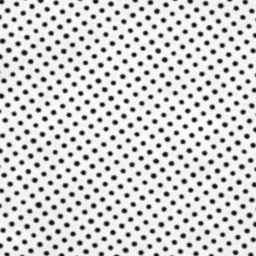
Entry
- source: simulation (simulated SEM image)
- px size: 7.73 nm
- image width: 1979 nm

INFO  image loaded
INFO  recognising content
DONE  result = a regular array of holes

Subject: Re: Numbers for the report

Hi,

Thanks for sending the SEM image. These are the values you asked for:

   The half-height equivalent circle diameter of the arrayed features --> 44.5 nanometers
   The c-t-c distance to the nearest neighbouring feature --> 83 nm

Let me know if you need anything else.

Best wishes